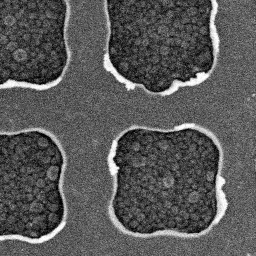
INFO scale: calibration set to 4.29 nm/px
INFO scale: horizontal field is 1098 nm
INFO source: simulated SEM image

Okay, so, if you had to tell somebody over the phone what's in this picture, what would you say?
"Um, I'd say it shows holes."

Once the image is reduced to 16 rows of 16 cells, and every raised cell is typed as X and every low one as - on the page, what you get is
----XXX------XXX
----XXX------XXX
----XXX------XXX
----XXX------XXX
----XXX------XXX
XXXXXXXXX--XXXXX
XXXXXXXXXXXXXXXX
XXXXXXXXXXXXXXXX
---XXXXX-----XXX
----XXX-------XX
----XXX-------XX
----XXX-------XX
----XXX-------XX
----XXX-------XX
---XXXXX--X--XXX
XXXXXXXXXXXXXXXX